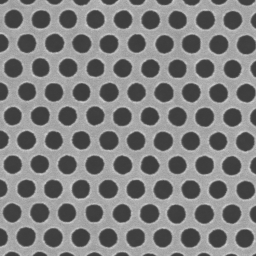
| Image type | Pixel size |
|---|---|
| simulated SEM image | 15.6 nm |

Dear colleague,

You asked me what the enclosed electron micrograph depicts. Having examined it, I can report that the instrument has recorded a regular array of holes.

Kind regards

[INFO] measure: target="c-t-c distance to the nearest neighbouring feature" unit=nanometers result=423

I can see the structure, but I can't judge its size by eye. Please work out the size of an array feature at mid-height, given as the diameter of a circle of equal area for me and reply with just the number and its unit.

19.3 px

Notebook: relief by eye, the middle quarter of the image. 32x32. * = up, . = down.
...***....**.....**.....**.....*
...**.....**.....**.....**.....*
...***....***....***....**....**
**************.******.******.***
********************************
***...***....****...***....***..
**.....**.....**....***....**...
**.....**.....**.....**.....*...
**....***....***....***....***..
*****************..*****..*****.
*******.************************
...***....***...****...***....**
...**.....**.....**.....**....**
...***....**.....**.....**.....*
...***....**.....***...***....**
.******.******.************..***
********************************
**....***....***....***....***..
**.....**.....**....**.....**...
**.....**.....**....**.....**...
**....***....***....**.....***..
****.*****..*****..*****..*****.
********************************
...***...****...****...****...**
...**.....***....**.....**.....*
...**.....**.....**.....**.....*
...***....***....**.....**....**
..****...*****.******.******.***
********************************
***...****..****...****...****..
**.....**....***....**.....**...
**.....**....**.....**.....**...